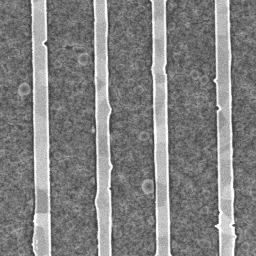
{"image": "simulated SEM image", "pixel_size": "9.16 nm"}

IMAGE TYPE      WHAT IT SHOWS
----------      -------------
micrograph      one or a few lines or trenches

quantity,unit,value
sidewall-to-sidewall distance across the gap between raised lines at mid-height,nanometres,444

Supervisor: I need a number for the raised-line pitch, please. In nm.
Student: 560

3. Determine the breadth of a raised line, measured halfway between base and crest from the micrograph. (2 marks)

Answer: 121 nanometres